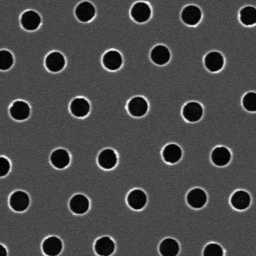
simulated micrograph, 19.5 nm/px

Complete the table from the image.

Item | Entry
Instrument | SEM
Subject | a regular array of holes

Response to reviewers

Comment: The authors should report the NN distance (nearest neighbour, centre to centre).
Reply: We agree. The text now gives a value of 0.936 microns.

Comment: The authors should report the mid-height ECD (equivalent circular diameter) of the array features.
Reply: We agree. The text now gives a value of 0.392 um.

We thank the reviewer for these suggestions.